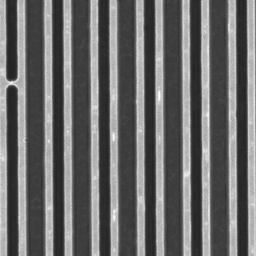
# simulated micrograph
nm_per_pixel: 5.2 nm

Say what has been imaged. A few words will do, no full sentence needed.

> parallel lines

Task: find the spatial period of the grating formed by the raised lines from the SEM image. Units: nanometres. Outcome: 122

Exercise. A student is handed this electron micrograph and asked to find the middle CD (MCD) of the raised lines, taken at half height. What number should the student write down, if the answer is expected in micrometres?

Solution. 0.0494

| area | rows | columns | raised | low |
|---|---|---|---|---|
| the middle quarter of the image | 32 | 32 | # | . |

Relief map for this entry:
##.....##..##.....##...##....###
##.....##..##.....##...##....###
##.....##..##.....##...##....###
##.....##..##.....##...##....###
##.....##..##.....##...##....###
##.....##..##.....##...##....###
##.....##..##.....##...##....###
##.....##..##.....##...##....###
##.....##..##.....##...##....###
##.....##..##.....##...##....###
##.....##..##.....##...##....###
##.....##..##.....##...##....###
##.....##..##.....##...##....###
##.....##..##.....##...##....###
##.....##..##.....##...##.....##
##.....##..##.....##...##.....##
##.....##..##.....##...##.....##
##.....##..##.....##...##.....##
##.....##..##.....##...##.....##
##.....##..##.....##...##.....##
##.....##..###....##...##.....##
##.....##..###....##...##.....##
##.....##..###....##...##.....##
##.....##..###....##...##.....##
##.....##..###....##...##.....##
##.....##..###....##...##.....##
##.....##..###....##...##.....##
##.....##..###....##...##.....##
##.....##..###....##...##.....##
##.....##..###....##...##.....##
##.....##..###....##...##.....##
##.....##..###....##...##.....##